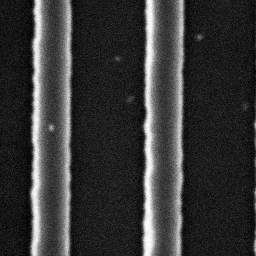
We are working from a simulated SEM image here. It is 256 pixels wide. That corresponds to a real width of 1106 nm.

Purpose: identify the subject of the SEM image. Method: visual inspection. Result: lines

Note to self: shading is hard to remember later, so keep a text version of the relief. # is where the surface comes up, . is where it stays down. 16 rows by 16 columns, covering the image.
..##.....##.....
..##.....##.....
..##.....##.....
..##.....##.....
..##.....##.....
..##.....##.....
..##.....##.....
..##.....##.....
..##.....##.....
..##.....##.....
..##.....##.....
..##.....##.....
..##.....##.....
..##.....##.....
..##.....##.....
..##.....##.....